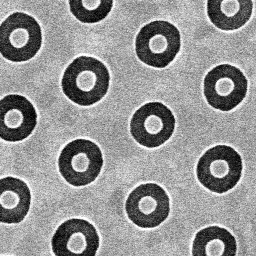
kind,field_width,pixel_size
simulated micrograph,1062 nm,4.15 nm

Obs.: ring-shaped grooves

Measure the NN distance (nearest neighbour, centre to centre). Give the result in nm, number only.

333